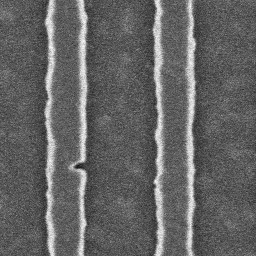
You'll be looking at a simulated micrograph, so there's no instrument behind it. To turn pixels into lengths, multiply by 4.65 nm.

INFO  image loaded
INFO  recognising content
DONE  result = one or a few lines or trenches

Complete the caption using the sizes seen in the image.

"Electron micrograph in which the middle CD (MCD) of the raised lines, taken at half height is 156 nm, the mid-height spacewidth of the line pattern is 350 nm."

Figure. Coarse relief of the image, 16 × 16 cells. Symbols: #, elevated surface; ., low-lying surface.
...##.....##....
...##.....##....
...##.....##....
...##.....##....
...##.....##....
...##.....##....
...##.....##....
...##.....##....
...##.....##....
...##.....##....
...##.....##....
...##.....##....
...##.....##....
...##.....##....
...##.....##....
...##.....##....